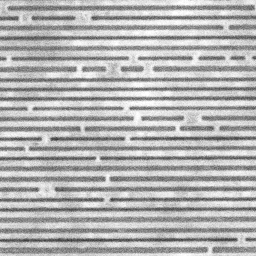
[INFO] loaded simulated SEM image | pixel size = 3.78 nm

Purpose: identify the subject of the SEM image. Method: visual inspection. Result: parallel lines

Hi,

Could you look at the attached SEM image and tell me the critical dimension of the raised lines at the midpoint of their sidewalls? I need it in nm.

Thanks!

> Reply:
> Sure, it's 18.4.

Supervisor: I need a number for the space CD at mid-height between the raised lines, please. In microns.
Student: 0.0189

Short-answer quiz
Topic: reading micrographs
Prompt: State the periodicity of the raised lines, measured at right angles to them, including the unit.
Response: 37.9 nm